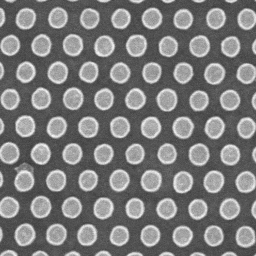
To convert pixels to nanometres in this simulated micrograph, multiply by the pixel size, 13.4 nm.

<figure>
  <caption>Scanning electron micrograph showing a regular array of raised bodies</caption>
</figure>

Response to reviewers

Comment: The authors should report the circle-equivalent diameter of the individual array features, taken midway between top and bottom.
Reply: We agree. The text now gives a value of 263 nm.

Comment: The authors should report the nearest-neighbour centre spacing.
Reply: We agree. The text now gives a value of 414 nm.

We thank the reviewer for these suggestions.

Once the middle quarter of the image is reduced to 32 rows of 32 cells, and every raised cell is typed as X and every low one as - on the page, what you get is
-----XXX-----XXX----XXXX----XXXX
X---XXXX----XXXX----XXXX----XXXX
X---XXXX----XXXX----XXXX----XXXX
----XXXX----XXXX----XXXX----XXXX
------X------XX------XX------XX-
--------------------------------
-XXX------X------XX------X------
XXXX----XXXX----XXXX----XXXX----
XXXX----XXXX---XXXXX---XXXXX----
XXXXX---XXXX---XXXXX---XXXXX----
XXXX----XXXX----XXX-----XXXX----
-------------------------XX-----
--------------------------------
-------------XX------XX------X--
----XXXX----XXXX----XXXX----XXXX
----XXXX----XXXX---XXXXX---XXXXX
----XXXX----XXXX---XXXXX---XXXXX
----XXXX----XXXX----XXX-----XXXX
-----------------------------XX-
--------------------------------
-XXX-----XX------XX-----XXX-----
XXXX----XXXX----XXXX----XXXX---X
XXXX----XXXX----XXXX----XXXX---X
XXXX----XXXX----XXXX----XXXX---X
-XX-----XXX-----XXX-----XXX-----
--------------------------------
--------------------------------
----XXXX----XXXX----XXXX----XXX-
----XXXX----XXXX----XXXX----XXXX
----XXXX----XXXX---XXXXX----XXXX
----XXXX----XXXX----XXXX----XXXX
-------------XX-----XXX-----XXX-